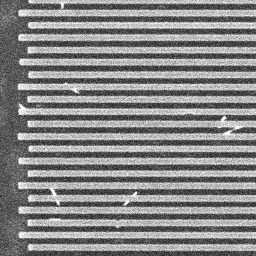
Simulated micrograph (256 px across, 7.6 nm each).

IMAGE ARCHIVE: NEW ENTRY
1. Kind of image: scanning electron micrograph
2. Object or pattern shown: parallel lines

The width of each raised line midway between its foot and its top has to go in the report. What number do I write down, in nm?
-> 44.6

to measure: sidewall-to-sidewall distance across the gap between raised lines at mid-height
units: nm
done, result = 52.2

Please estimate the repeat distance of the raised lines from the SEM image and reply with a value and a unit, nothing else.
93.8 nm